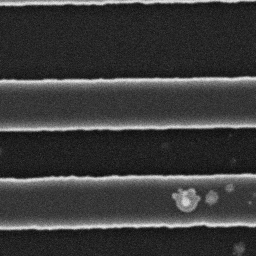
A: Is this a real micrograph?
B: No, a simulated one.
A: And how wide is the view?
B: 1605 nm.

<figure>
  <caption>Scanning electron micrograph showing lines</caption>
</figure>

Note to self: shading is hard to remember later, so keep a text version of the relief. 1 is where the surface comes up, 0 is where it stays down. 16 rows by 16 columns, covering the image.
0000000000000000
0000000000000000
0000000000000000
0000000000000000
0000000000000000
1111111111111111
1111111111111111
1111111111111111
0000000000000000
0000000000000000
0000000000000000
1111111111111111
1111111111111111
1111111111111111
0000000000000000
0000000000000000